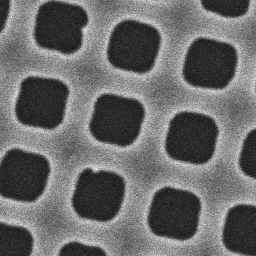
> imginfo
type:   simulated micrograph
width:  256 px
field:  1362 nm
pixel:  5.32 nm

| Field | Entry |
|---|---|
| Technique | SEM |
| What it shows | holes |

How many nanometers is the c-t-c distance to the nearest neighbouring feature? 407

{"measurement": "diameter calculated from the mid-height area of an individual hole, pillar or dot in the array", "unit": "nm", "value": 290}